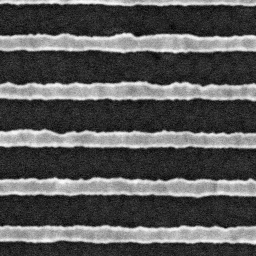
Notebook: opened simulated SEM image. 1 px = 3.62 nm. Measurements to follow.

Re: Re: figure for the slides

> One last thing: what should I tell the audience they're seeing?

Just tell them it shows lines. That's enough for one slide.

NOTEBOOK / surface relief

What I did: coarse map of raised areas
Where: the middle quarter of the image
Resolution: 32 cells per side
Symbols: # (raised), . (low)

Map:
................................
................................
................................
................................
...................##...........
################################
################################
################################
##########.#####################
................................
................................
................................
................................
................................
................................
................................
................................
################################
################################
################################
###..##########################.
................................
................................
................................
................................
................................
................................
................................
.......##.....#.................
################################
################################
################################